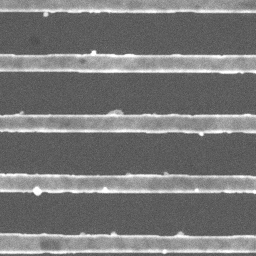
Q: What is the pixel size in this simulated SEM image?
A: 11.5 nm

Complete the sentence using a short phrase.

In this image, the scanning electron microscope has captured lines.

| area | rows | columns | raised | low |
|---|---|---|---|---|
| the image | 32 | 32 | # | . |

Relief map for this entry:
################################
.........#....########..########
................................
................................
................................
................................
................................
################################
################################
................................
................................
................................
................................
................................
################################
################################
..................###..#####..##
................................
................................
................................
................................
................................
################################
################################
................................
................................
................................
................................
................................
####################.###.....###
################################
################################